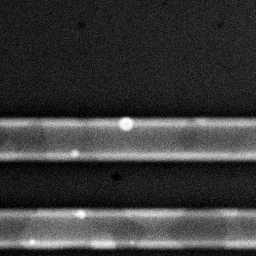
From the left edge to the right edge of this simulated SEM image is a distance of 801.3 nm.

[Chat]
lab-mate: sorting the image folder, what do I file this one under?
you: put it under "wiring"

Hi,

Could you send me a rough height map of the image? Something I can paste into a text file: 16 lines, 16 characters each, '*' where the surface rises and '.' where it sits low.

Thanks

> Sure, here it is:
................
................
................
................
................
................
................
.......*........
****************
****************
................
................
................
****************
****************
................